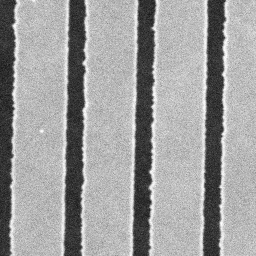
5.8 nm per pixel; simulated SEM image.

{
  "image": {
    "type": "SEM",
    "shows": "lines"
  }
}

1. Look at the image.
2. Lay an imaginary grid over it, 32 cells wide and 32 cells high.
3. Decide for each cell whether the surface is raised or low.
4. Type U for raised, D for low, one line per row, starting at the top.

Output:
DDUUUUUUUDDUUUUUUDDDUUUUUUDDUUUU
DDUUUUUUUDDUUUUUUDDUUUUUUUDDUUUU
DDUUUUUUUDDUUUUUUDDUUUUUUUDDUUUU
DDUUUUUUUDDUUUUUUDDUUUUUUUDDUUUU
DDUUUUUUUDDUUUUUUDDUUUUUUUDDUUUU
DDUUUUUUUDDUUUUUUDDUUUUUUUDDUUUU
DDUUUUUUUDDUUUUUUDDUUUUUUUDDUUUU
DDUUUUUUDDDUUUUUUDDUUUUUUUDDUUUU
DDUUUUUUDDDUUUUUUDDUUUUUUUDDUUUU
DDUUUUUUDDDUUUUUUDDUUUUUUUDDUUUU
DDUUUUUUDDDUUUUUUDDUUUUUUUDDUUUU
DDUUUUUUDDDUUUUUUDDUUUUUUUDDUUUU
DDUUUUUUDDDUUUUUUDDUUUUUUUDDUUUU
DDUUUUUUDDDUUUUUUDDUUUUUUUDDUUUU
DDUUUUUUDDDUUUUUUDDUUUUUUUDDUUUU
DDUUUUUUDDDUUUUUUDDUUUUUUUDDUUUU
DDUUUUUUDDDUUUUUUDDUUUUUUUDDUUUU
DDUUUUUUDDUUUUUUUDDUUUUUUUDDUUUU
DDUUUUUUDDUUUUUUUDDUUUUUUUDDUUUU
DDUUUUUUDDUUUUUUUDDUUUUUUUDDUUUU
DDUUUUUUDDUUUUUUUDDUUUUUUUDDUUUU
DDUUUUUUDDUUUUUUUDDUUUUUUUDDUUUU
DDUUUUUUDDDUUUUUUDDUUUUUUUDDUUUU
DUUUUUUUDDUUUUUUUDDUUUUUUUDDUUUU
DDUUUUUUDDUUUUUUUDDUUUUUUUDDUUUU
DDUUUUUUDDUUUUUUUDDUUUUUUDDDUUUU
DDUUUUUUDDUUUUUUUDDUUUUUUDDDUUUU
DUUUUUUUDDUUUUUUUDDUUUUUUDDDUUUU
DUUUUUUUDDUUUUUUDDDUUUUUUDDDUUUU
DUUUUUUUDDUUUUUUUDDUUUUUUDDDUUUU
DUUUUUUUDDUUUUUUUDDUUUUUUDDUUUUU
DUUUUUUUDDUUUUUUDDDUUUUUUDDDUUUU